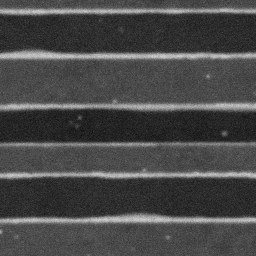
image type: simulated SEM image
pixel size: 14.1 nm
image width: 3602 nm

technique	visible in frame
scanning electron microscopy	lines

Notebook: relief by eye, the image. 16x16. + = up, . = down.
++++++++++++++++
................
................
...............+
++++++++++++++++
++++++++++++++++
++++++++++++++++
................
................
++++++++++++++++
++++++++++++++++
................
................
................
++++++++++++++++
++++++++++++++++